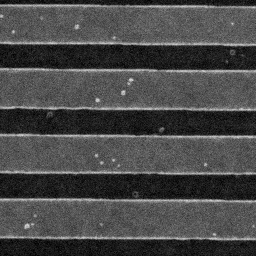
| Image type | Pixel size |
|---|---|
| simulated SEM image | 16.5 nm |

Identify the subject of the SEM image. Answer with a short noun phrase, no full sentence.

lines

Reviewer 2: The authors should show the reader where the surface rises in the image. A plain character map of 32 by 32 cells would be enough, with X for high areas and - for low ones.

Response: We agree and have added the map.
--------------------------------
XXXXXXXXXXXXXXXXXXXXXXXXXXXXXXXX
XXXXXXXXXXXXXXXXXXXXXXXXXXXXXXXX
XXXXXXXXXXXXXXXXXXXXXXXXXXXXXXXX
XXXXXXXXXXXXXXXXXXXXXXXXXXXXXXXX
---------------XXXXXXXXXXXXXXXXX
--------------------------------
--------------------------------
--------------------------------
XXXXXXXXXXXXXXXXXXXXXXXXXXXXXXXX
XXXXXXXXXXXXXXXXXXXXXXXXXXXXXXXX
XXXXXXXXXXXXXXXXXXXXXXXXXXXXXXXX
XXXXXXXXXXXXXXXXXXXXXXXXXXXXXXXX
XXXXXXXXXXXXXXXXXXXXXXXXXXXXXXXX
--------------------------------
--------------------------------
--------------------------------
XXXXXXXXXXXXXXXXXXXXXXXXXXXXXXXX
XXXXXXXXXXXXXXXXXXXXXXXXXXXXXXXX
XXXXXXXXXXXXXXXXXXXXXXXXXXXXXXXX
XXXXXXXXXXXXXXXXXXXXXXXXXXXXXXXX
XXXXXXXXXXXXXXXXXXXXXXXXXXXXXXXX
--------------------------------
--------------------------------
--------------------------------
XXXXXXXXXXXXXXXXXXXXXXXXXXXXXXXX
XXXXXXXXXXXXXXXXXXXXXXXXXXXXXXXX
XXXXXXXXXXXXXXXXXXXXXXXXXXXXXXXX
XXXXXXXXXXXXXXXXXXXXXXXXXXXXXXXX
XXXXXXXXXXXXXXXXXXXXXXXXXXXXXXXX
--------------------------------
--------------------------------